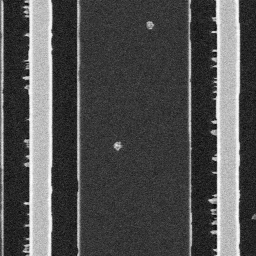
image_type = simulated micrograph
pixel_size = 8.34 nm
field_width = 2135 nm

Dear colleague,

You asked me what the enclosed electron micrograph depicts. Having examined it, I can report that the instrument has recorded lines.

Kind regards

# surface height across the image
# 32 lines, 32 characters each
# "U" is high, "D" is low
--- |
DDDDUUDDDDUUUUUUUUUUUUUUDDDUUUDD
DDDDUUDDDDUUUUUUUUUUUUUUDDDUUUDD
DDDDUUDDDDUUUUUUUUUUUUUUDDDUUUDD
DDDDUUDDDDUUUUUUUUUUUUUUDDDUUUDD
DDDDUUDDDDUUUUUUUUUUUUUUDDDUUUDD
DDDDUUDDDDUUUUUUUUUUUUUUDDDUUUDD
DDDDUUDDDDUUUUUUUUUUUUUUDDDUUUDD
DDDDUUDDDDUUUUUUUUUUUUUUDDDUUUDD
DDDDUUDDDDUUUUUUUUUUUUUUDDDUUUDD
DDDDUUDDDDUUUUUUUUUUUUUUDDDUUUDD
DDDDUUDDDDUUUUUUUUUUUUUUDDDUUUDD
DDDDUUDDDDUUUUUUUUUUUUUUDDDUUUDD
DDDDUUDDDDUUUUUUUUUUUUUUDDDUUUDD
DDDDUUDDDDUUUUUUUUUUUUUUDDDUUUDD
DDDDUUDDDDUUUUUUUUUUUUUUDDDUUUDD
DDDDUUDDDDUUUUUUUUUUUUUUDDDUUUDD
DDDDUUDDDDUUUUUUUUUUUUUUDDDUUUDD
DDDDUUDDDDUUUUUUUUUUUUUUDDDUUUDD
DDDDUUDDDDUUUUUUUUUUUUUUDDDUUUDD
DDDDUUDDDDUUUUUUUUUUUUUUDDDUUUDD
DDDDUUDDDDUUUUUUUUUUUUUUDDDUUUDD
DDDDUUDDDDUUUUUUUUUUUUUUDDDUUUDD
DDDDUUDDDDUUUUUUUUUUUUUUDDDUUUDD
DDDDUUDDDDUUUUUUUUUUUUUUDDDUUUDD
DDDDUUDDDDUUUUUUUUUUUUUUDDDUUUDD
DDDDUUDDDDUUUUUUUUUUUUUUDDDUUUDD
DDDDUUDDDDUUUUUUUUUUUUUUDDDUUUDD
DDDDUUDDDDUUUUUUUUUUUUUUDDDUUUDD
DDDDUUDDDDUUUUUUUUUUUUUUDDDUUUDD
DDDDUUDDDDUUUUUUUUUUUUUUDDDUUUDD
DDDDUUDDDDUUUUUUUUUUUUUUDDDUUUDD
DDDDUUDDDDUUUUUUUUUUUUUUDDDUUUDD